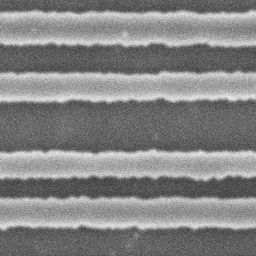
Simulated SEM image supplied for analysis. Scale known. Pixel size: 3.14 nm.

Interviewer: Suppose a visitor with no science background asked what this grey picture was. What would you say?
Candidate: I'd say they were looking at lines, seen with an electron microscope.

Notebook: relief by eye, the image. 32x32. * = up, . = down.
................................
....*.................**.......*
********************************
********************************
********************************
.***...*****.*.****..***..******
................................
................................
................................
********************************
********************************
********************************
********...***.......*.*........
................................
................................
................................
................................
................................
................................
********************************
********************************
********************************
................................
................................
................................
********************************
********************************
********************************
*.............**.**.....*....*..
................................
................................
................................